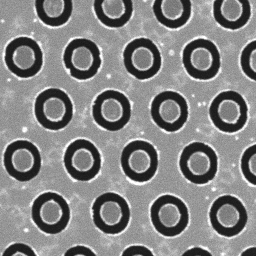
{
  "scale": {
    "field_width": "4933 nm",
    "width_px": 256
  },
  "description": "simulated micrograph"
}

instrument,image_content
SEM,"a regular array of ring-shaped grooves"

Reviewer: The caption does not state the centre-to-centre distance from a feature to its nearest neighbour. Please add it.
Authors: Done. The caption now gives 1130 nm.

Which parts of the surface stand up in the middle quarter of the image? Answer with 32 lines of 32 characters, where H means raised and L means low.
LLLHHHHLLHHHHHHLLLHHHHLLHHHHHHLL
HLLLLLLLLHHHHHHLLLLLLLLLHHHHHHLL
HHLLLLLLHHHHHHHHLLLLLLLHHHHHHHHL
HHHLLLLHHHHHHHHHHHLLLLHHHHHHHHHH
HHHHHHHHHHHHHHHHHHHHHHHHHHHHHHHH
HHHHHHHHHHHHHHHHHHHHHHHHHHHHHHHH
HHHHHHHHHHLLHHHHHHHHHHHHHHLHHHHH
LHHHHHHHHLLLLLLHHHHHHHHHLLLLLHHH
LHHHHHHHLLLLLLLLHHHHHHHLLLLLLLHH
LLHHHHHLLLHHHLLLHHHHHHLLLHHHLLLH
LLHHHHHLLLHHHHLLLHHHHHLLHHHHHLLH
LLHHHHHLLHHHHHHLLHHHHHLLHHHHHLLH
LLHHHHHLLLHHHHHLLHHHHHLLHHHHHLLH
LLHHHHHLLLHHHHLLLHHHHHLLLHHHLLLH
LLHHHHHHLLLLLLLLHHHHHHHLLLHLLLHH
LHHHHHHHHLLLLLLHHHHHHHHLLLLLLLHH
HHHHHHHHHHHLLLHHHHHHHHHHHLLLHHHH
HHHHHHHHHHHHHHHHHHHHHHHHHHHHHHHH
HHHHHHHHHHHHHHHHHHHHHHHHHHHHHHHH
HHLLLLLHHHHHHHHHHLLLLHHHHHHHHHHH
HLLLLLLLHHHHHHHLLLLLLLHHHHHHHHLL
LLLLHHLLLHHHHHHLLLLLLLLHHHHHHHLL
LLLHHHHLLHHHHHLLLHHHHLLHHHHHHLLL
LLHHHHHLLHHHHHLLHHHHHLLLHHHHHLLL
LLHHHHHLLHHHHHLLHHHHHLLLHHHHHLLH
LLHHHHHLLHHHHHLLHHHHHLLHHHHHHLLH
HLLHHHLLLHHHHHHLLHHHHLLHHHHHHLLL
HLLLLLLLHHHHHHHLLLLLLLLHHHHHHHLL
HHLLLLLHHHHHHHHHLLLLLLHHHHHHHHLL
HHHHHHHHHHHHHHHHHHLLLHHHHHHHHHHH
HHHHHHHHHHHHHHHHHHHHHHHHHHHHHHHH
HHHHHHHHHHHHHHHHHHHHHHHHHHHHHHHH